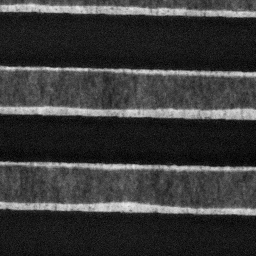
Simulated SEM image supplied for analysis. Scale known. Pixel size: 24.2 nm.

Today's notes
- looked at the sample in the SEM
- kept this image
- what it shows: lines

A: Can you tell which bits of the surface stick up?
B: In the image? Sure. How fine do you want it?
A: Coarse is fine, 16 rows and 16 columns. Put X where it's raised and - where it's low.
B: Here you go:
XXXXXXXXXXXXXXXX
----------------
----------------
----------------
XXXXXXXXXXXXXXX-
XXXXXXXXXXXXXXXX
XXXXXXXXXXXXXXXX
----------------
----------------
----------------
XXXXXXXXXXXXXXXX
XXXXXXXXXXXXXXXX
XXXXXXXXXXXXXXXX
----------------
----------------
----------------